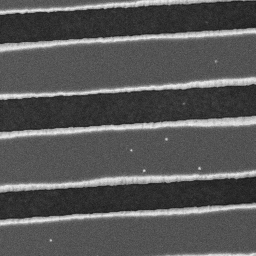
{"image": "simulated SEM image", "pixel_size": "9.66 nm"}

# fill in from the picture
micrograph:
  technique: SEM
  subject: lines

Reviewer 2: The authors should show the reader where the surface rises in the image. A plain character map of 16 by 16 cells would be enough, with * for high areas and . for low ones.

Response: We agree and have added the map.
******..........
................
.....***********
****************
****************
**********......
................
...............*
****************
****************
****************
******..........
................
.....***********
****************
****************